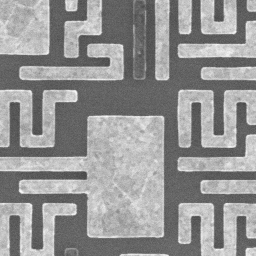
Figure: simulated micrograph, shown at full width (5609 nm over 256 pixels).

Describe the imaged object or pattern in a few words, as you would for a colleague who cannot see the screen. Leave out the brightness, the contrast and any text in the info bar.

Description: wiring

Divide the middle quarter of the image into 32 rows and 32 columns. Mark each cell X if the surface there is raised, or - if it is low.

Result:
-----------XXXX---XX---XXX------
XXXXXXXXXXXXXXX---XX---XXX------
XXXXXXXXXXXXXXX---XX---XXX------
XXXXXXXXXXXXXXX---XX---XXX------
--------------------------------
--------------------------------
--------------------------------
XXX--------------------------XXX
XXX--------------------------XXX
-----------------------------XXX
-----------------------------XXX
-----------------------------XXX
-----------------------------XXX
------XXXXXXXXXXXXXXXXXXX----XXX
------XXXXXXXXXXXXXXXXXXX----XXX
------XXXXXXXXXXXXXXXXXXX----XXX
------XXXXXXXXXXXXXXXXXXX----XXX
------XXXXXXXXXXXXXXXXXXX----XXX
------XXXXXXXXXXXXXXXXXXX----XXX
------XXXXXXXXXXXXXXXXXXX----XXX
------XXXXXXXXXXXXXXXXXXX----XX-
------XXXXXXXXXXXXXXXXXXX-------
------XXXXXXXXXXXXXXXXXXX-------
--XXXXXXXXXXXXXXXXXXXXXXX-------
XXXXXXXXXXXXXXXXXXXXXXXXX----XXX
XXXXXXXXXXXXXXXXXXXXXXXXX----XXX
XXXXXXXXXXXXXXXXXXXXXXXXX----XXX
------XXXXXXXXXXXXXXXXXXX-------
------XXXXXXXXXXXXXXXXXXX-------
XXXXXXXXXXXXXXXXXXXXXXXXX-------
XXXXXXXXXXXXXXXXXXXXXXXXX-------
XXXXXXXXXXXXXXXXXXXXXXXXX-------